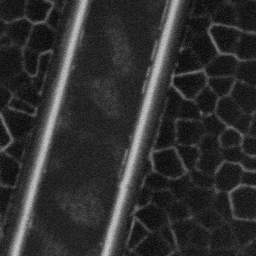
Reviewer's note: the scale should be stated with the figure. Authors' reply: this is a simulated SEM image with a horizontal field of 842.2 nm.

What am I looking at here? one or a few lines or trenches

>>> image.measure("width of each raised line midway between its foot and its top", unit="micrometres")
0.291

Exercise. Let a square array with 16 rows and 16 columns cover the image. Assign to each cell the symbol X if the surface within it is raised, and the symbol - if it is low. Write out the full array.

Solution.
-----XXXXXX-----
-----XXXXXX-----
-----XXXXX------
----XXXXXX------
----XXXXXX------
----XXXXX-------
---XXXXXX-------
---XXXXXX-------
---XXXXXX-------
---XXXXX--------
--XXXXXX--------
--XXXXXX--------
--XXXXXX--------
--XXXXX---------
-XXXXXX---------
-XXXXXX---------